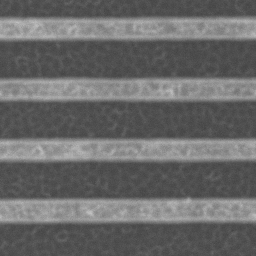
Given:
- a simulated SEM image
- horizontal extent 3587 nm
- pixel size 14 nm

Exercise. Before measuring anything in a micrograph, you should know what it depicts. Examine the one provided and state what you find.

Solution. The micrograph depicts parallel lines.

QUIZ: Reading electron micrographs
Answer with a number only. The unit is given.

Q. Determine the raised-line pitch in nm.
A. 849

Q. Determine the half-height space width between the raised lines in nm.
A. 564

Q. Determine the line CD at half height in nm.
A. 287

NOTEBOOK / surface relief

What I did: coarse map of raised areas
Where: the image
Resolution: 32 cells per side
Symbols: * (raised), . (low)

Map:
................................
................................
**.*******.....*.***************
********************************
********************************
................................
................................
................................
................................
................................
********************************
********************************
................................
................................
................................
................................
................................
..............****..............
********************************
********************************
................................
................................
................................
................................
................................
********************************
********************************
********************************
................................
................................
................................
................................